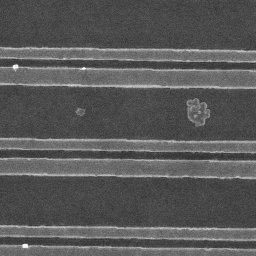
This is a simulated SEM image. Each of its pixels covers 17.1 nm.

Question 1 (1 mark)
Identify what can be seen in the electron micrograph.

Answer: lines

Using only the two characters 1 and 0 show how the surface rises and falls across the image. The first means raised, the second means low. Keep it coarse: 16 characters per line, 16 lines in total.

0000000000000000
0000000000000000
0000000000000000
1111111111111111
1111111111111111
0000000000000001
0000000000000000
0000000000000000
0000000000000000
1111111111111111
1111111111111111
0000000000000000
0000000000000000
0000000000000000
1111111111111111
1111111111111111